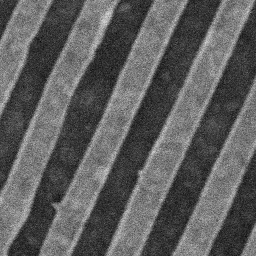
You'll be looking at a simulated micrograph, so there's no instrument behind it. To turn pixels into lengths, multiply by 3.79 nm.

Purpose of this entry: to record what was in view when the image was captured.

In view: one or a few lines or trenches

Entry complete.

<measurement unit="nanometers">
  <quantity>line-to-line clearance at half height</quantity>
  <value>129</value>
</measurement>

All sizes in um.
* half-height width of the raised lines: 0.104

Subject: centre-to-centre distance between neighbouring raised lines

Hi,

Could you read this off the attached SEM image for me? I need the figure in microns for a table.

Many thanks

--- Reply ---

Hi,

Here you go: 0.234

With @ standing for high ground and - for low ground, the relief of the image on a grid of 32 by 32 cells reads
--@@@@-----@@@-----@@@@-----@@@@
--@@@@----@@@@-----@@@@----@@@@-
-@@@@-----@@@-----@@@@-----@@@@-
-@@@@----@@@@-----@@@@-----@@@--
@@@@-----@@@-----@@@@-----@@@@--
@@@-----@@@@-----@@@@-----@@@---
@@@-----@@@@----@@@@-----@@@@---
@@@----@@@@-----@@@@-----@@@----
@@@----@@@@-----@@@-----@@@@----
@@----@@@@-----@@@@-----@@@-----
@@----@@@@-----@@@-----@@@@-----
@-----@@@-----@@@@-----@@@@----@
@----@@@@-----@@@-----@@@@-----@
-----@@@-----@@@@-----@@@@-----@
----@@@@-----@@@@----@@@@-----@@
----@@@@-----@@@-----@@@@-----@@
----@@@-----@@@@----@@@@-----@@@
---@@@@-----@@@-----@@@@-----@@@
---@@@-----@@@@----@@@@-----@@@@
--@@@@-----@@@-----@@@@-----@@@-
--@@@@----@@@@----@@@@-----@@@@-
--@@@-----@@@-----@@@@-----@@@--
-@@@@----@@@@-----@@@-----@@@@--
-@@@-----@@@-----@@@@-----@@@---
@@@@----@@@@-----@@@@----@@@@---
@@@@---@@@@@----@@@@-----@@@@---
@@@----@@@@-----@@@@----@@@@----
@@@----@@@@----@@@@-----@@@@----
@@----@@@@-----@@@@----@@@@-----
@@----@@@@-----@@@-----@@@@-----
@-----@@@-----@@@@----@@@@-----@
@----@@@@-----@@@-----@@@@-----@